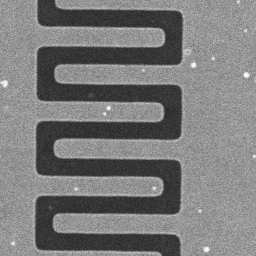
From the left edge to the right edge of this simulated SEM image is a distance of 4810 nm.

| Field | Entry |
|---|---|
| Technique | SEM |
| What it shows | groups of lines, slits or small figures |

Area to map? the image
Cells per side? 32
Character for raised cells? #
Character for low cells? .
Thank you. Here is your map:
#####..#########################
#####.................##########
#####..................#########
###################....#########
####################...#########
####################...#########
#####..................#########
#####..................#########
#####..#########################
#####..#########################
#####.................##########
#####..................#########
#####..................#########
####################...#########
####################...#########
#####..................#########
####...................#########
####...######.........##########
####...#########################
####...#########################
####...................#########
#####..................#########
####################...#########
####################...#########
#####..................#########
####...................#########
####..................##########
####...#########################
####...#########################
####..................##########
####...................#########
###############........#########